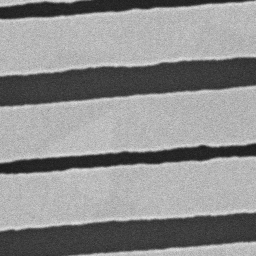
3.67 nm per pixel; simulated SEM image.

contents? lines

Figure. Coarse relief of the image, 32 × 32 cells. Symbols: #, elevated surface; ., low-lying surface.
###.........................####
...............#################
.###############################
################################
################################
################################
################################
########################........
###########.....................
................................
................................
.......................#########
...........#####################
################################
################################
################################
################################
################################
######################..........
#########.......................
.................#..############
......##########################
################################
################################
################################
################################
################################
################................
####............................
................................
.............................###
................################